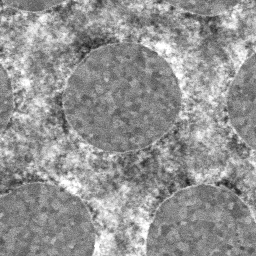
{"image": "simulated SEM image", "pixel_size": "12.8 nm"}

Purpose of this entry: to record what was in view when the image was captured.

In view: raised bodies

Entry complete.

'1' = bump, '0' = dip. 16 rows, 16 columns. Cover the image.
0110000000011100
0000000000000000
0000000000000000
0000011111000000
0000011111100001
1000111111100011
1000111111100011
1000111111100011
0000011111000001
0000000000000000
0000000000000000
0010000000000000
1111100000111110
1111110000111111
1111110001111111
1111110001111111